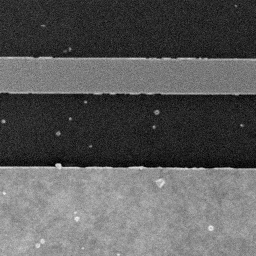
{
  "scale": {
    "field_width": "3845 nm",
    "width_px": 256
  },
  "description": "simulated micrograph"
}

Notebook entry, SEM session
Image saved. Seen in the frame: lines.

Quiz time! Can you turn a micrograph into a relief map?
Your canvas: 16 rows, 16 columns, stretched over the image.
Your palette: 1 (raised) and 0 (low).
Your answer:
0000000000000000
0000000000000000
0000000000000000
0000000000000000
0000000000000000
0000000000000000
0000000000000000
0000000000000000
0000000000000000
0000000000000000
1111111010000000
1111111111111111
1111111111111111
1111111111111111
1111111111111111
1111111111111111